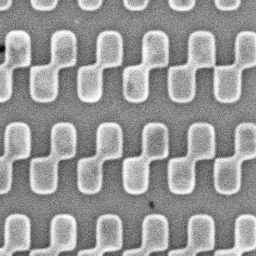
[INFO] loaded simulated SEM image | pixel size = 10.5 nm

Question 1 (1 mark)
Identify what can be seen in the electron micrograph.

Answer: wiring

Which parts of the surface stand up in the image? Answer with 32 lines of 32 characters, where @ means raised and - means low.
@---@@@---@@@---@@---@@@---@@@--
--------------------------------
--------------------------------
--------------------------------
-@@----@@----@@---@@@---@@@---@@
-@@@---@@---@@@---@@@---@@@---@@
-@@@---@@---@@@---@@@---@@@---@@
-@@@--@@@---@@@---@@@---@@@--@@@
@@--@@@@--@@@---@@@---@@@--@@@@-
@---@@@---@@@---@@---@@@---@@@--
@---@@@---@@@---@@---@@@---@@@--
@---@@@---@@@---@@---@@@---@@@--
@----@----@@----@@----@@---@@---
--------------------------------
--------------------------------
-@@----@@----@-----@----@@----@@
-@@@---@@---@@@---@@@---@@@---@@
-@@@---@@---@@@---@@@---@@@---@@
-@@@--@@@---@@@---@@@---@@@---@@
@@@---@@@---@@@--@@@@--@@@@--@@@
@---@@@---@@@---@@@--@@@---@@@--
@---@@@---@@@---@@---@@@---@@@--
@---@@@---@@@---@@---@@@---@@@--
@---@@@---@@----@@---@@@---@@@--
--------------------------------
--------------------------------
--------------------------------
-@@----@@---@@@---@@@---@@----@@
-@@@--@@@---@@@---@@@---@@@---@@
-@@@--@@@---@@@---@@@---@@@---@@
-@@@--@@@---@@@---@@@--@@@@--@@@
@@--@@@@--@@@---@@@--@@@@--@@@--